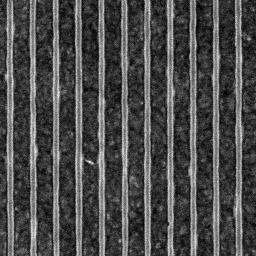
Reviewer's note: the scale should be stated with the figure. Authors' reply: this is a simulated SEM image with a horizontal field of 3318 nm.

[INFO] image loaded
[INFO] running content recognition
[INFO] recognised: parallel lines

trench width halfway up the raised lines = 0.227 µm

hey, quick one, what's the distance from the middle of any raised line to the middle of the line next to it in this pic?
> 296 nm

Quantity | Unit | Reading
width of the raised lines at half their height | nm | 64.8